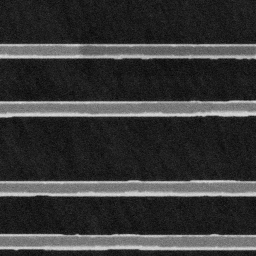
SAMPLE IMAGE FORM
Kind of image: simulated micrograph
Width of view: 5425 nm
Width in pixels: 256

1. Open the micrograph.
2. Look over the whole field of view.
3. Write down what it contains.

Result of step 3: lines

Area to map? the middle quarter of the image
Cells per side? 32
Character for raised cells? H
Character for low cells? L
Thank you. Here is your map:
LLLLLLLLLLLLLLLLLLLLLLLLLLLLLLLL
LLLLLLLLLLLLLLLLLLLLLLLLLLLLLLLL
LLLLLLLLLLLLLLLLLLLLLLLLLLLLLLLL
LLLLLLLLLLLLLLLLLLLLLLLLLLLLLLLL
LLLLLLLLLLLLLLLLLLLLLLLLLLLLLLLL
LLLLLLLLLLLLLLLLLLLLLLLLLLLLLLLL
LLLLLLLLLLLLLLLLLLLLLLLLLLLLLLLL
LLLLLLLLLLLLLLLLLLLLLLLLLLLLLLLL
LLLLLLLLLLLLLLLLLLLLLLLLLLLLLLLL
LLLLLLLLLLLLLLLLLLLLLLLLLLLLLLLH
HHHHHHHHHHHHHHHHHHHHHHHHHHHHHHHH
HHHHHHHHHHHHHHHHHHHHHHHHHHHHHHHH
HHHHHHHHHHHHHHHHHHHHHHHHHHHHHHHH
LLLLLLLLLLLLLLLLLLLLLLLLLLLLLLLL
LLLLLLLLLLLLLLLLLLLLLLLLLLLLLLLL
LLLLLLLLLLLLLLLLLLLLLLLLLLLLLLLL
LLLLLLLLLLLLLLLLLLLLLLLLLLLLLLLL
LLLLLLLLLLLLLLLLLLLLLLLLLLLLLLLL
LLLLLLLLLLLLLLLLLLLLLLLLLLLLLLLL
LLLLLLLLLLLLLLLLLLLLLLLLLLLLLLLL
LLLLLLLLLLLLLLLLLLLLLLLLLLLLLLLL
LLLLLLLLLLLLLLLLLLLLLLLLLLLLLLLL
LLLLLLLLLLLLLLLLLLLLLLLLLLLLLLLL
LLLLLLLLLLLLLLLLLLLLLLLLLLLLLLLL
LLLLLLLLLLLLLLLLLLLLLLLLLLLLLLLL
LLLLLLLLLLLLLLLLLLLLLLLLLLLLLLLL
LLLLLLLLLLLLLLLLLLLLLLLLLLLLLLLL
LLLLLLLLLLLLLLLLLLLLLLLLLLLLLLLL
LLLLLLLLLLLLLLLLLLLLLLLLLLLLLLLL
HHHHHHHHHHHHHHHHHHHHHHHHHHHHHHHH
HHHHHHHHHHHHHHHHHHHHHHHHHHHHHHHH
HHHHHHHHHHHHHHHHHHHHHHHHHHHHHHHH